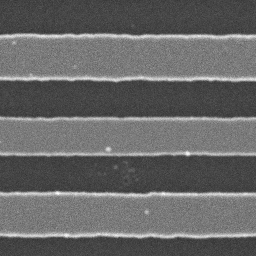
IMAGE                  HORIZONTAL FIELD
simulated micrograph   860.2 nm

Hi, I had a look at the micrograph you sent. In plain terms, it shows lines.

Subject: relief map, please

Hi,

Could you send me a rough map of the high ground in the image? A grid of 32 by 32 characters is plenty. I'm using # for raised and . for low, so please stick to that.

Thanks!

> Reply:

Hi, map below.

................................
................................
................................
................................
###########################.####
################################
################################
################################
################################
################################
................................
................................
................................
................................
................................
################################
################################
################################
################################
................................
................................
................................
................................
................................
################################
################################
################################
################################
################################
.#####..##.#..#################.
................................
................................